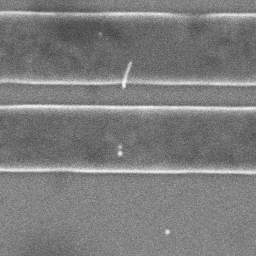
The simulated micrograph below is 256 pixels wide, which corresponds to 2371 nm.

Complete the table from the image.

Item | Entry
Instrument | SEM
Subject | wiring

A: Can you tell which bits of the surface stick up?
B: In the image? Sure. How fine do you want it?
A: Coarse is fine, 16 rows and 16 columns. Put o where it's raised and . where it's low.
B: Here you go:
................
oooooooooooooooo
oooooooooooooooo
oooooooooooooooo
oooooooooooooooo
................
................
oooooooooooooooo
oooooooooooooooo
oooooooooooooooo
oooooooooooooooo
................
................
................
................
................